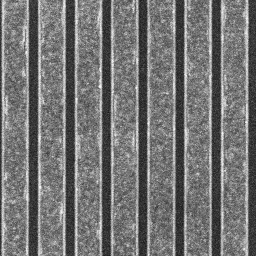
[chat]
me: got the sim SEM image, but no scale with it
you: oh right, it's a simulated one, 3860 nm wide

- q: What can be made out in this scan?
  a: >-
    parallel lines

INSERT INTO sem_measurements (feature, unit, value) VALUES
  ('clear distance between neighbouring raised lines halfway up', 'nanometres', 158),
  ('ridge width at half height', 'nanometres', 398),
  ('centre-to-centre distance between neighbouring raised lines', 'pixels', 36.6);